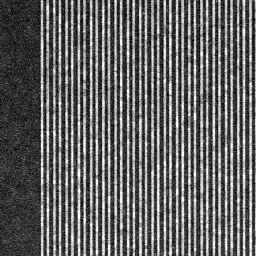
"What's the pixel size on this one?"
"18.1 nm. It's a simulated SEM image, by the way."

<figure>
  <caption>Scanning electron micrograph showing parallel lines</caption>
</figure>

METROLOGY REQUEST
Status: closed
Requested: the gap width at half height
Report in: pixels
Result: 4.25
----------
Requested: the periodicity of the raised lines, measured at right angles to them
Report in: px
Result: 6.14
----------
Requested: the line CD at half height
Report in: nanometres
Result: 29.5